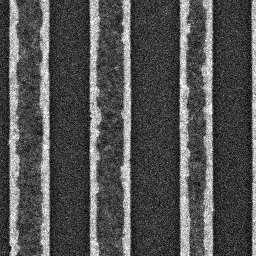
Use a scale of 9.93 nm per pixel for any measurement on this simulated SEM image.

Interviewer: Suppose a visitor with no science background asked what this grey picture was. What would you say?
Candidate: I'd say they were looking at one or a few lines or trenches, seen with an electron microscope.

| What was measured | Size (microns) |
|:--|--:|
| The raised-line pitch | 0.828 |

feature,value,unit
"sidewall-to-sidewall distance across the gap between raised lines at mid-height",0.475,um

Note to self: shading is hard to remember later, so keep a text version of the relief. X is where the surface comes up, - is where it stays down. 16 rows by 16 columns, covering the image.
-XX---XX---XX---
-XX---XX---XX---
-XX---XX---XX---
-XX---XX---XX---
-XX---XX---XX---
-XX---XX---XX---
-XX---XX---XX---
-XX---XX---XX---
-XX---XX---XX---
-XX---XX---XX---
-XX---XX---XX---
-XX---XX---XX---
-XX---XX---XX---
-XX---XX---XX---
-XX---XX----X---
-XX---XX----X---